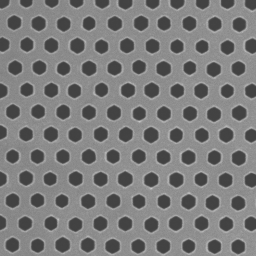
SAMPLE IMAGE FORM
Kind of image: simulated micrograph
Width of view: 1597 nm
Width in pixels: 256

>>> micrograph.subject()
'a regular array of holes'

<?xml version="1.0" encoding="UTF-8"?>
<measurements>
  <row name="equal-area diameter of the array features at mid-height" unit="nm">86.5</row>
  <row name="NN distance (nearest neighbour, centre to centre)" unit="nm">153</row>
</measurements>